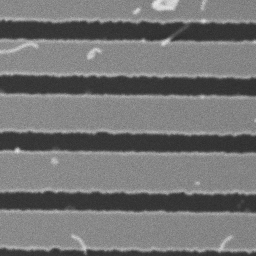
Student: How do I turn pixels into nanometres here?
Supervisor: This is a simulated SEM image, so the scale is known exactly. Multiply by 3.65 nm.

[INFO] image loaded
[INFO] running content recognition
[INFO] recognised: lines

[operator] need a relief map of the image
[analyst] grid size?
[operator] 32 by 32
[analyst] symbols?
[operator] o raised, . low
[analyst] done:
oooooooooooooooooooooooooooooooo
oooooooooooooooooooooooooooooooo
oooooooooooooooooooooooooooooooo
................................
................................
oooooooooooooooooooooooooooooooo
oooooooooooooooooooooooooooooooo
oooooooooooooooooooooooooooooooo
oooooooooooooooooooooooooooooooo
............oo..oooooooooooooooo
................................
................................
oooooooooooooooooooooooooooooooo
oooooooooooooooooooooooooooooooo
oooooooooooooooooooooooooooooooo
oooooooooooooooooooooooooooooooo
.....ooooooo.ooooooooooooooooooo
................................
................................
oooooooooooooooooooooooooooooooo
oooooooooooooooooooooooooooooooo
oooooooooooooooooooooooooooooooo
oooooooooooooooooooooooooooooooo
oooooooooooooooooooooooooooooooo
................................
................................
oooooooooooooooooooooooo....o...
oooooooooooooooooooooooooooooooo
oooooooooooooooooooooooooooooooo
oooooooooooooooooooooooooooooooo
oooooooooooooooooooooooooooooooo
...............................o